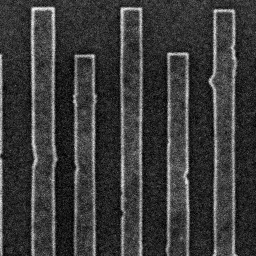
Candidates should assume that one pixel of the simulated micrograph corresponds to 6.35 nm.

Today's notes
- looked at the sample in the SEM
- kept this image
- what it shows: parallel lines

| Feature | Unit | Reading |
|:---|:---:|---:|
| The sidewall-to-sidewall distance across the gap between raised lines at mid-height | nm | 172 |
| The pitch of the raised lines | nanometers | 287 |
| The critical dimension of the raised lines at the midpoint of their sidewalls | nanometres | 125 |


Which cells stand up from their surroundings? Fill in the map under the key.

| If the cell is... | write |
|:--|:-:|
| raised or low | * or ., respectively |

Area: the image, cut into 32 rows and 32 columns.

................................
....***........***.........**...
....***........***.........**...
....***........***.........**...
....***........***.........**...
....***........***.........**...
....***........***.........**...
....***..***...***...**....**...
....***..***...***...**....**...
....***...**...***...**....**...
....***...**...***...**...***...
....***..***...***...**....**...
....***..***...***...**....**...
....***...**...***...**....**...
....***...**...***...**....**...
....***...**...***...**....**...
....***...**...***...**....**...
....***...**...***...**....**...
....***...**...***...**....**...
....***...**...***...**....**...
....***...**...***...**....**...
....***...**...***...**....**...
....***...**...***...**....**...
....***...**...***...**....**...
....***..***...***...**....**...
....***...**...***...***...**...
....***..***...***...***...**...
....***..***...***...***...**...
....***..***...***...***...**...
....***..***...***...***...**...
....***..***...***...**....**...
....***..***...***...**....**...